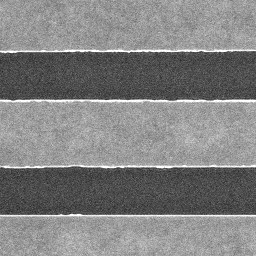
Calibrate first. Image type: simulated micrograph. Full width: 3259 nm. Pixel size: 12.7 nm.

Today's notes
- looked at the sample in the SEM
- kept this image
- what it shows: lines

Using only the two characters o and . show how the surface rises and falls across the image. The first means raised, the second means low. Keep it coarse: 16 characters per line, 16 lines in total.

oooooooooooooooo
oooooooooooooooo
oooooooooooooooo
................
................
................
oooooooooooooooo
oooooooooooooooo
oooooooooooooooo
oooooooooooooooo
................
................
................
oooooooooooooooo
oooooooooooooooo
oooooooooooooooo